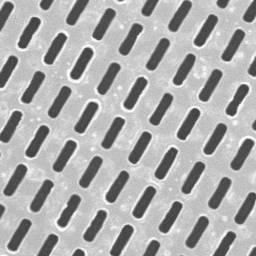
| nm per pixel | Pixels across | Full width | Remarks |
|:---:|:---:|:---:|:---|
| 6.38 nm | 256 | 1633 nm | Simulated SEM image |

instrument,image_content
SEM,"a regular array of holes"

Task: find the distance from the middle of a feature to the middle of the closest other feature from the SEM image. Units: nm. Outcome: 195